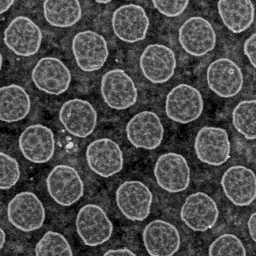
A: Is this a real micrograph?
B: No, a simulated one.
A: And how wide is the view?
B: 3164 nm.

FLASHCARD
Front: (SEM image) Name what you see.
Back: a regular array of raised bodies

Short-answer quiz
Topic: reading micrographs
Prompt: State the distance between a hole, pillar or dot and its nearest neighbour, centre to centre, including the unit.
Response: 587 nanometers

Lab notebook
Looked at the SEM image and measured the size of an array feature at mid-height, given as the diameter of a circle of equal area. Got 440 nm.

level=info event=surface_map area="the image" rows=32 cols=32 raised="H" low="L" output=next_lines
HLLLLLHHHHLLLLLLLLLHHHHLLLLHHHHL
LLLLLLHHHHLLLLLHHHLLHHLLLLLLHHHH
LLHHLLHHHLLLLLHHHHLLLLLLHHLLHHHL
LHHHHLLLLLLLLLHHHHLLLLLHHHLLLHHL
LHHHHLLLLLHHLLLHHHLLLLLHHHHLLLLL
LHHHHLLLLHHHHLLLLLLLLLLHHHHLLLLH
LLHHLLLLLHHHHLLLLLHHHLLLHHLLLLLH
LLLLLHHLLLHHHLLLLLHHHHLLLLLLLLLH
LLLLHHHHLLHHLLLLLLHHHHLLLLHHHHLL
LLLLHHHHHLLLLHHHLLHHHLLLLLHHHHLL
LLLLLHHHLLLLLHHHHLLLLLLLLLHHHHLL
HHHLLLHHLLLLLHHHHLLLLHHHHLLHHHLL
HHHHLLLLLLLLLHHHHLLLLHHHHLLLLLLL
HHHLLLLLHHHLLLLLLLLLLHHHHLLLLLHH
HHHLLLLLHHHHLLLLLHHLLHHHHLLLLHHH
LLLLLLLLHHHHLLLLHHHHLLLLLLLLLHHH
LLLHHHLLLHHLLLLLHHHHLLLLLHHHLLHH
LLLHHHHLLLLLLHLLHHHHLLLLLHHHLLLL
LLLHHHHLLLLHHHHLLLLLLLLLLHHHHLLL
HLLHHHLLLLLHHHHLLLLLLHLLLHHHLLLL
HHLLLLLLLLLHHHHLLLLLHHHLLLLLLLLL
HHLLLLLHHLLLHHLLLLLHHHHHLLLLHHHL
HHLLLLHHHHLLLLLLLLLLHHHHLLLLHHHH
LLLLLLHHHHLLLLLHHHLLLHHLLLLLHHHH
LLHHLLLHHHLLLLLHHHHLLLLLHHLLLHHH
LHHHHLLLHLLLLLLHHHHLLLLHHHHLLLLL
LHHHHLLLLLHHHLLHHHLLLLLHHHHLLLLL
LHHHHLLLLLHHHLLLLLLLLLLHHHHLLLLH
LLLHLLLLLLHHHHLLLLHHHHLLHHLLLLLH
LLLLLLHHLLHHHHLLLLHHHHLLLLLLHLLH
LLLLLHHHLLLHLLLLLLHHHHLLLLLHHHLL
LLLLLHHHHLLLLLHHLLLHHHLLLLHHHHHL